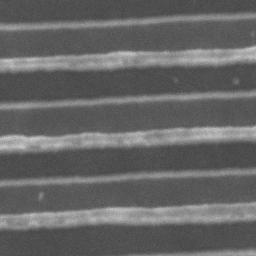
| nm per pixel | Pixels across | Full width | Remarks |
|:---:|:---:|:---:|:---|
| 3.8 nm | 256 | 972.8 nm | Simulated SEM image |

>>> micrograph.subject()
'lines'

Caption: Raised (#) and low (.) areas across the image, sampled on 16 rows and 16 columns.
................
.......#########
################
################
................
................
....############
################
################
................
................
################
################
################
................
................